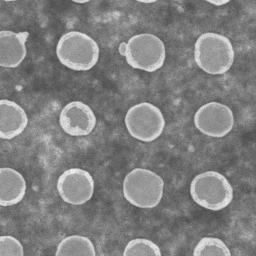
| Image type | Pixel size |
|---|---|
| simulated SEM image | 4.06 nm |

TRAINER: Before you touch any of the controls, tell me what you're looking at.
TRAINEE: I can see a regular array of raised bodies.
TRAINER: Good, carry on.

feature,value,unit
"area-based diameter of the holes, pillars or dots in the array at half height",153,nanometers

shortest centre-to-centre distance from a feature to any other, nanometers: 272